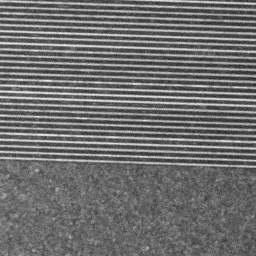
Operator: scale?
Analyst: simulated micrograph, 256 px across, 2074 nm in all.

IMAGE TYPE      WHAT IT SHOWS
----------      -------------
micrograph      parallel lines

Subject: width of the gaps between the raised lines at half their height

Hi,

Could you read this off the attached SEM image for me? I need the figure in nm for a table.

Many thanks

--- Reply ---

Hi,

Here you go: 36.4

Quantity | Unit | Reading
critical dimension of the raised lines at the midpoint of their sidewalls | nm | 12.1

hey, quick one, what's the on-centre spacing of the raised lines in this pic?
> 48.8 nm